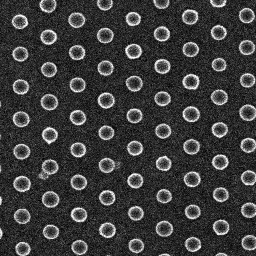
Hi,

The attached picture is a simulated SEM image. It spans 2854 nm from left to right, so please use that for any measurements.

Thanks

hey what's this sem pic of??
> a regular array of raised bodies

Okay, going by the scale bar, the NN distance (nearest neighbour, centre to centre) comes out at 360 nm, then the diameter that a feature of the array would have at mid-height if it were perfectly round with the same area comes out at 0.165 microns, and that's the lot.